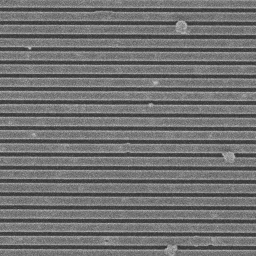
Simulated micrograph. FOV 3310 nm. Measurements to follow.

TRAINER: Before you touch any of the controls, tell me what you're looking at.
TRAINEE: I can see parallel lines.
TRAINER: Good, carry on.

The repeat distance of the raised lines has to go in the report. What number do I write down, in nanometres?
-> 171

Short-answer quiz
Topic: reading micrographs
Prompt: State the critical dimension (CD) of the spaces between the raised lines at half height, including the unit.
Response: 0.0517 micrometres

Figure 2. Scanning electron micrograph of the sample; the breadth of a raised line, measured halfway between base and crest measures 8.88 pixels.